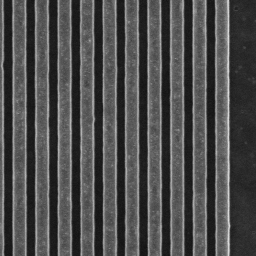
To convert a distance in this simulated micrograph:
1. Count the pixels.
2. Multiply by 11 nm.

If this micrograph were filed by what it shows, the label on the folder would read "parallel lines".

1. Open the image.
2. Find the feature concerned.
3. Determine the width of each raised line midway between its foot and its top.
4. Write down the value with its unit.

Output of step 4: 139 nanometres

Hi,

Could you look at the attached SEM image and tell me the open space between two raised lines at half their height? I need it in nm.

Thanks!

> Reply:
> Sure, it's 108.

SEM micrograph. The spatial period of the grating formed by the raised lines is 247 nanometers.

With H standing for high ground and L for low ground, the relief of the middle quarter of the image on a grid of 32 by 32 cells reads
HHLLHHHLLLHHHLLHHHLLLHHHLLLHHHLL
HHLLHHHLLLHHHLLHHHLLLHHHLLLHHHLL
HHLLHHHLLLHHHLLLHHHLLHHHLLLHHHLL
HHLLHHHLLLHHHLLHHHHLLHHHLLLHHHLL
HHLLHHHLLLHHHLLHHHHLLHHHLLLHHHLL
HLLLHHHLLLHHHLLHHHHLLHHHLLLHHHLL
HHLLHHHLLLHHHLLHHHHLLHHHLLLHHHLL
HHLLHHHLLLHHHLLHHHHLLHHHLLLHHHLL
HHLLHHHLLLHHHLLHHHHLLHHHLLLHHHLL
HHLLHHHLLLHHHLLHHHHLLHHHLLLHHHLL
HHLLHHHLLLHHHLLLHHHLLHHHLLLHHHLL
HHLLHHHLLLHHHLLLHHHLLHHHLLLHHHLL
HHLLHHHLLLHHHLLLHHHLLHHHLLLHHHLL
HHLLHHHLLLHHHLLHHHLLLHHHLLLHHHLL
HHLLHHHLLLHHHLLHHHHLLHHHLLLHHHLL
HHLLHHHLLLHHHLLHHHHLLHHHLLLHHHLL
HHLLHHHLLLHHHLLHHHHLLHHHLLLHHHLL
HHLLHHHLLLHHHLLHHHHLLHHHLLLHHHLL
HHLLHHHLLLHHHLLLHHHLLHHHLLLHHHLL
HHLLHHHLLLHHHLLHHHHLLHHHLLLHHHLL
HHLLHHHLLLHHHLLHHHHLLHHHLLLHHHLL
HHLLHHHLLLHHHLLHHHHLLHHHLLLHHHLL
HHLLHHHLLLHHHLLLHHHLLHHHLLLHHHLL
HHLLHHHLLLHHHLLLHHHLLHHHLLLHHHLL
HHLLHHHLLLHHHLLHHHHLLHHHLLLHHHLL
HHLLHHHLLLHHHLLHHHHLLHHHLLLHHHLL
HHLLHHHLLLHHHLLLHHHLLHHHLLLHHHLL
HHLLHHHLLLHHHLLLHHHLLHHHLLLHHHLL
HHLLHHHLLLHHHLLLHHHLLHHHLLLHHHLL
HHLLHHHLLLHHHLLLHHHLLHHHLLLHHHLL
HHLLHHHLLLHHHLLLHHHLLHHHLLLHHHLL
HHLLHHHLLLHHHLLLHHHLLHHHLLLHHHLL